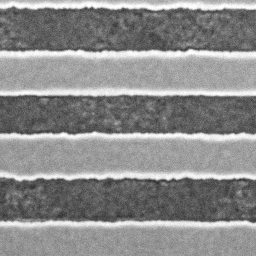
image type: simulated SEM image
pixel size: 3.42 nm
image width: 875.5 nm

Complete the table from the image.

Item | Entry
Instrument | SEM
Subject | lines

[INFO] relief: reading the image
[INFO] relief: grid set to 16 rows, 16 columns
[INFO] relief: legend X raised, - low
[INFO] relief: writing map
--XX---XXXX-XXXX
----------------
----------------
XXXXXXXXXXXXXXXX
XXXXXXXXXXXXXXXX
XXXXXXXXXXXXXXXX
----------------
----------------
XXXXXXXXXXXXX-XX
XXXXXXXXXXXXXXXX
XXXXXXXXXXXXXXXX
----------------
----------------
----------------
XXXXXXXXXXXXXXXX
XXXXXXXXXXXXXXXX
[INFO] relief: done